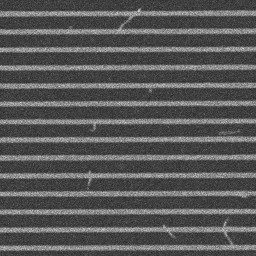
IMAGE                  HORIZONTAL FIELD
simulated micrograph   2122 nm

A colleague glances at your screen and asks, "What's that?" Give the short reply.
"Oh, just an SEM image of parallel lines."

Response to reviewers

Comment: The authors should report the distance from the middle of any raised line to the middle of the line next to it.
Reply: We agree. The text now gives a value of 149 nanometres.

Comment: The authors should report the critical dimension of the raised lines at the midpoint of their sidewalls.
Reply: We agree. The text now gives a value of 32.1 nanometres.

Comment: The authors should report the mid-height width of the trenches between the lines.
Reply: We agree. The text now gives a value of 14.2 px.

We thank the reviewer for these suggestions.